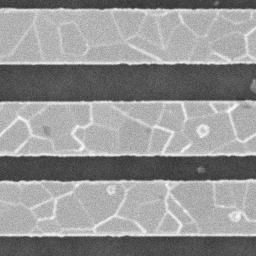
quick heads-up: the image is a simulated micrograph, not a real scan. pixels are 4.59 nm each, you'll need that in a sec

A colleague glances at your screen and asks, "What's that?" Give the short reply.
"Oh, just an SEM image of lines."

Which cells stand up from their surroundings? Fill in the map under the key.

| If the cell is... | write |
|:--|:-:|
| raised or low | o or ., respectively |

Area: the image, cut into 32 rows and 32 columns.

................................
oooooooooooooooooooooooooooooooo
oooooooooooooooooooooooooooooooo
oooooooooooooooooooooooooooooooo
oooooooooooooooooooooooooooooooo
oooooooooooooooooooooooooooooooo
oooooooooooooooooooooooooooooooo
oooooooooooooooooooooooooooooooo
................................
................................
................................
................................
................................
oooooooooooooooooooooooooooooooo
oooooooooooooooooooooooooooooooo
oooooooooooooooooooooooooooooooo
oooooooooooooooooooooooooooooooo
oooooooooooooooooooooooooooooooo
oooooooooooooooooooooooooooooooo
................................
................................
................................
...............................o
oooooooooooooooooooooooooooooooo
oooooooooooooooooooooooooooooooo
oooooooooooooooooooooooooooooooo
oooooooooooooooooooooooooooooooo
oooooooooooooooooooooooooooooooo
oooooooooooooooooooooooooooooooo
.......o......o.................
................................
................................